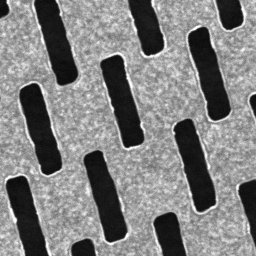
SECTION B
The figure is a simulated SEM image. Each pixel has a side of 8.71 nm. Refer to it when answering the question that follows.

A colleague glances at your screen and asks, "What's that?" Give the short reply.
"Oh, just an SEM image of holes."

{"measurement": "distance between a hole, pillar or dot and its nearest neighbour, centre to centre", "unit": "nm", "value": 793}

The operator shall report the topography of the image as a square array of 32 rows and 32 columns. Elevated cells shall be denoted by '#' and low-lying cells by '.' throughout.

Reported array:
.###...#########...########...##
.###....########...########...##
#####...#########...########..##
#####...#########...#####.##.###
#####...#########...####..######
######...#########...###..######
######...#########..####...#####
######...####..#########...#####
######....###...#########..#####
#######...###...#########...####
####.##..####...#########...####
##...########...#########...####
##....########...#########...##.
###...########...#########...##.
###...########...#########..####
###...#########...####..########
####...########...####...#######
####...########...####...#######
####...###############...#######
####....###..##########...######
#####...###..##########...######
#####..####...#########...######
#..########...#########...######
#...#######....#########...###..
#...########...#########...###..
#...########...#########...###..
##...#######...################.
##...########...###...#########.
##...########...###....########.
##...########...####...########.
###...###...########...#########
###...###...########...#########